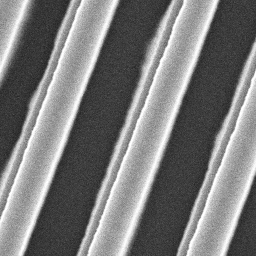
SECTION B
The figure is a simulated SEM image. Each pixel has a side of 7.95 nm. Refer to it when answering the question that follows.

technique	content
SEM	lines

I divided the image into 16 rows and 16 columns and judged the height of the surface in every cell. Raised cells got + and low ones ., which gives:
++..+++....++...
+...+++...+++...
+...++....+++...
...+++....++....
...+++...+++...+
...++....+++...+
..+++...+++....+
..++....+++...++
.+++....++....++
.+++...+++....++
.++....+++...+++
+++....++....+++
+++...+++...+++.
++....+++...+++.
++...+++....++..
++...+++...+++..